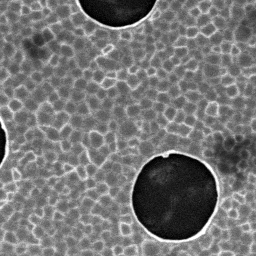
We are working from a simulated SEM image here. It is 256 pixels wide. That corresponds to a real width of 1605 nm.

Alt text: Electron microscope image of holes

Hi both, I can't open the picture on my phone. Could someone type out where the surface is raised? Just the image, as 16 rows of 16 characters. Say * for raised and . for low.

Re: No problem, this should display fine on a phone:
*****.....******
******..********
****************
****************
****************
****************
****************
****************
****************
****************
*********....***
********......**
********......**
*********....***
*********...****
****************